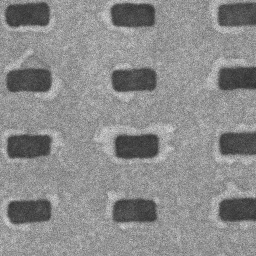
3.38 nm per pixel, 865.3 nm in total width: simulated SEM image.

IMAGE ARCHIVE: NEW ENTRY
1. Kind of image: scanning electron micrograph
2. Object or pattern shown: a regular array of holes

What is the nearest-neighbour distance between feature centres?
220 nm